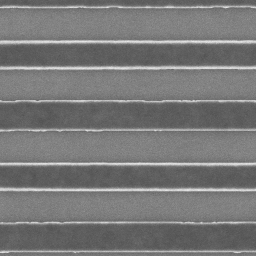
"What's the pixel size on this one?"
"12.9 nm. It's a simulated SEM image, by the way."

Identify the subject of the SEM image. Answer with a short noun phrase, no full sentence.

lines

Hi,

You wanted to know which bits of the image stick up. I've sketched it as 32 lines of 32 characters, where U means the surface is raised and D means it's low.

UUUUUUUUUUUUUUUUUUUUUUUUUUUUUUUU
DDDDDDDDDDDDDDDDDDDDDDDDDDDDDDDD
DDDDDDDDDDDDDDDDDDDDDDDDDDDDDDDD
DDDDDDDDDDDDDDDDDDDDDDDDDDDDDDDD
DDDDDDDDDDDDDDDDDDDDDDDDDDDDDDDD
UUUUUUUUUUUUUUUUUUUUUUUUUUUUUUUU
UUUUUUUUUUUUUUUUUUUUUUUUUUUUUUUU
UUUUUUUUUUUUUUUUUUUUUUUUUUUUUUUU
UUDUUUUUUUUUUDDUDDDUDDDDDDDDDDDD
DDDDDDDDDDDDDDDDDDDDDDDDDDDDDDDD
DDDDDDDDDDDDDDDDDDDDDDDDDDDDDDDD
DDDDDDDDDDDDDDDDDDDDDDDDDDDDDDDD
DDDDDDDDDDDDDDDDDDDDDDDDDDDDDDDD
UUUUUUUUUUUUUUUUUUUUUUUUUUUUUUUU
UUUUUUUUUUUUUUUUUUUUUUUUUUUUUUUU
UUUUUUUUUUUUUUUUUUUUUUUUUUUUUUUU
DDDDDDDDDDDDDDDDDDDDDDDDDDDDDDDD
DDDDDDDDDDDDDDDDDDDDDDDDDDDDDDDD
DDDDDDDDDDDDDDDDDDDDDDDDDDDDDDDD
DDDDDDDDDDDDDDDDDDDDDDDDDDDDDDDD
DDDDDDDDDDDDDDDDDDDDDDDDDDDDDDDD
UUUUUUUUUUUUUUUUUUUUUUUUUUUUUUUU
UUUUUUUUUUUUUUUUUUUUUUUUUUUUUUUU
UUUUUUUUUUUUUUUUUUUUUUUUUUUUUUUU
DDDDDDDDDDDDDDDDDDDDDDDDDDDDDDDD
DDDDDDDDDDDDDDDDDDDDDDDDDDDDDDDD
DDDDDDDDDDDDDDDDDDDDDDDDDDDDDDDD
DDDDDDDDDDDDDDDDDDDDDDDDDDDDDDDD
UUUUUUUUUUUUUUUUUUUUUUUUUUUUUUUU
UUUUUUUUUUUUUUUUUUUUUUUUUUUUUUUU
UUUUUUUUUUUUUUUUUUUUUUUUUUUUUUUU
UDDDDDDDDUDDDDDDDDDDDDDDDDDDDUDD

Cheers